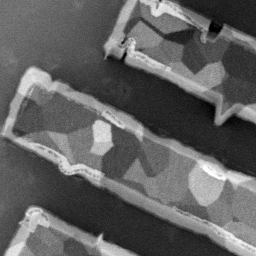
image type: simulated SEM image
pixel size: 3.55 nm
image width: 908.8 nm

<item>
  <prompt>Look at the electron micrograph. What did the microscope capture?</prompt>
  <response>one or a few lines or trenches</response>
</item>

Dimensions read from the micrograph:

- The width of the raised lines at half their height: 0.223 um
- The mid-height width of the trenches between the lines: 60.1 px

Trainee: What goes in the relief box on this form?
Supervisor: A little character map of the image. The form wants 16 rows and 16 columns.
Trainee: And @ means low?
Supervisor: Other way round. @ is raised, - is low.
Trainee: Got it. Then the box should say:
--------@@@-----
--------@@@@@---
-------@@@@@@@@-
--------@@@@@@@@
----------@@@@@@
-@@@--------@@@@
-@@@@@--------@@
-@@@@@@@--------
-@@@@@@@@-------
---@@@@@@@@-----
----@@@@@@@@@@--
-------@@@@@@@@@
---------@@@@@@@
--@--------@@@@@
-@@@---------@@@
-@@@@@@--------@